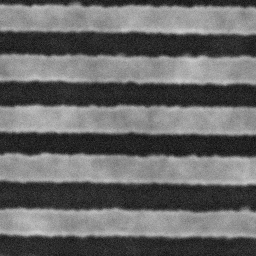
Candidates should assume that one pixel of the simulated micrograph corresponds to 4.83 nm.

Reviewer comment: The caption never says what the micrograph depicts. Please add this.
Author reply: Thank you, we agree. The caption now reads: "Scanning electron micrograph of lines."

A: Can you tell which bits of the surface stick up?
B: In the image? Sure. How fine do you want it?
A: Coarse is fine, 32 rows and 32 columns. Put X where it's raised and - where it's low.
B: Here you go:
--------------------------------
XXXXXXXXXXXXXXXXXXXXXXXXXXXXXXXX
XXXXXXXXXXXXXXXXXXXXXXXXXXXXXXXX
XXXXXXXXXXXXXXXXXXXXXXXXXXXXXXXX
--------------------------------
--------------------------------
--------------------------------
XXXXXXXXXXXXXXXXXXXXXXXXXXXXXXXX
XXXXXXXXXXXXXXXXXXXXXXXXXXXXXXXX
XXXXXXXXXXXXXXXXXXXXXXXXXXXXXXXX
--------------------------------
--------------------------------
--------------------------------
XXXXXXXXXXXXXXXXXXXXXXXXXXXXXXX-
XXXXXXXXXXXXXXXXXXXXXXXXXXXXXXXX
XXXXXXXXXXXXXXXXXXXXXXXXXXXXXXXX
-XXXXXXXXXXXXXXXXXXXXXXXXXXXXXXX
--------------------------------
--------------------------------
XXXXXXXXXXXXXXXX----X-----------
XXXXXXXXXXXXXXXXXXXXXXXXXXXXXXXX
XXXXXXXXXXXXXXXXXXXXXXXXXXXXXXXX
XXXXXXXXXXXXXXXXXXXXXXXXXXXXXXXX
--------------------------------
--------------------------------
--------------------------------
XXXXXXXXXXXXXXXXXXXXXXXX---XXXX-
XXXXXXXXXXXXXXXXXXXXXXXXXXXXXXXX
XXXXXXXXXXXXXXXXXXXXXXXXXXXXXXXX
---------------------XXX-XXXXXXX
--------------------------------
--------------------------------